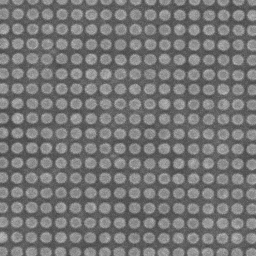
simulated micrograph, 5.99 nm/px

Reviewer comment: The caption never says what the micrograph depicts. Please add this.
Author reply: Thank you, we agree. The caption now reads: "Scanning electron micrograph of a regular array of raised bodies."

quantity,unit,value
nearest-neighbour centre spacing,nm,86.6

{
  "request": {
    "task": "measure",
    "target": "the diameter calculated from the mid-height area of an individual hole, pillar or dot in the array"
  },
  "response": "63.4 nm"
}